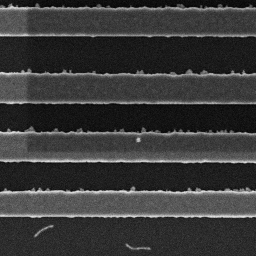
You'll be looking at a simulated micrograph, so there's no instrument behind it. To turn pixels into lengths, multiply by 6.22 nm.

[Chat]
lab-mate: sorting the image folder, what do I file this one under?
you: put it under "lines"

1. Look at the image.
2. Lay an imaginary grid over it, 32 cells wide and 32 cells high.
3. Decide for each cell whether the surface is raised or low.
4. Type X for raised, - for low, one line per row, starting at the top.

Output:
--------------------------------
XXXXXXXXXXXXXXXXXXXXXXXXXXXXXXXX
XXXXXXXXXXXXXXXXXXXXXXXXXXXXXXXX
XXXXXXXXXXXXXXXXXXXXXXXXXXXXXXXX
-----------X------X-XXX-XXXXXXXX
--------------------------------
--------------------------------
--------------------------------
--------------------------------
XXXXXXXXXXXXXXXXXXXXXXXXXXXXXXXX
XXXXXXXXXXXXXXXXXXXXXXXXXXXXXXXX
XXXXXXXXXXXXXXXXXXXXXXXXXXXXXXXX
XXXXXXXXXXXXXXXXXXXXXXXXXXXXXXXX
--------------------------------
--------------------------------
--------------------------------
XXXXXX-X-XXXXX----X-------------
XXXXXXXXXXXXXXXXXXXXXXXXXXXXXXXX
XXXXXXXXXXXXXXXXXXXXXXXXXXXXXXXX
XXXXXXXXXXXXXXXXXXXXXXXXXXXXXXXX
--------------------------------
--------------------------------
--------------------------------
--------------------------------
XXXXXXXXXXXXXXXXXXXXXXXXXXXXXXXX
XXXXXXXXXXXXXXXXXXXXXXXXXXXXXXXX
XXXXXXXXXXXXXXXXXXXXXXXXXXXXXXXX
--------------------------------
--------------------------------
--------------------------------
--------------------------------
--------------------------------